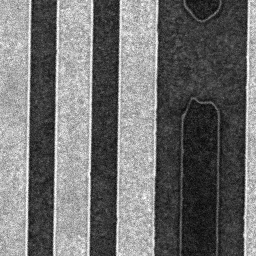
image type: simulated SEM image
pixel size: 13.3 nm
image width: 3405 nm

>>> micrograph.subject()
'one or a few lines or trenches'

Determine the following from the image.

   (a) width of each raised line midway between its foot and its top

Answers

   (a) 484 nanometers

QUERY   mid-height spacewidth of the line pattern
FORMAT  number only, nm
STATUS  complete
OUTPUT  379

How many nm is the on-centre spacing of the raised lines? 846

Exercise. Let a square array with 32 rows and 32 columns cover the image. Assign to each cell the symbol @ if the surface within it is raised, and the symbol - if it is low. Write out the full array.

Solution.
@@@@---@@@@----@@@@@---@@@@----@
@@@@---@@@@----@@@@@----@@@----@
@@@@---@@@@----@@@@@-----@-----@
@@@@---@@@@----@@@@------------@
@@@@---@@@@----@@@@@-----------@
@@@@---@@@@----@@@@@-----------@
@@@@---@@@@----@@@@@-----------@
@@@@---@@@@----@@@@@-----------@
@@@@---@@@@----@@@@------------@
@@@@---@@@@----@@@@------------@
@@@@---@@@@----@@@@------------@
@@@@---@@@@----@@@@------------@
@@@@---@@@@----@@@@-----@------@
@@@@---@@@@----@@@@----@@@@----@
@@@@---@@@@----@@@@----@@@@----@
@@@@---@@@@----@@@@----@@@@----@
@@@----@@@@----@@@@----@@@@----@
@@@----@@@@----@@@@----@@@@----@
@@@----@@@@----@@@@----@@@@----@
@@@----@@@@----@@@@----@@@@----@
@@@----@@@@----@@@@----@@@@----@
@@@----@@@@----@@@@----@@@@----@
@@@----@@@@----@@@@----@@@@----@
@@@----@@@@----@@@@----@@@@----@
@@@----@@@@----@@@@----@@@@----@
@@@----@@@@----@@@@----@@@@----@
@@@----@@@@----@@@@----@@@@----@
@@@----@@@@----@@@@----@@@@----@
@@@----@@@@----@@@@----@@@@----@
@@@----@@@@----@@@@----@@@@----@
@@@----@@@@----@@@@----@@@@----@
@@@----@@@@----@@@@----@@@@----@